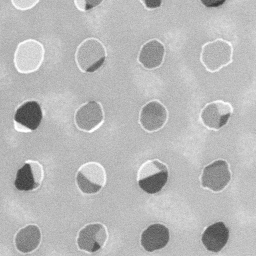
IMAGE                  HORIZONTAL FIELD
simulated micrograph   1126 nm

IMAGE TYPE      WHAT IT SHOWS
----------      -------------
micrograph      a regular array of raised bodies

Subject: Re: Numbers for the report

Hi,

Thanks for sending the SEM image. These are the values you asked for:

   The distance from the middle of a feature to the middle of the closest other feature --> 266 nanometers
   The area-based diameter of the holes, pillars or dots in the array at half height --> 134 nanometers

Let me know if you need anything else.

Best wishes